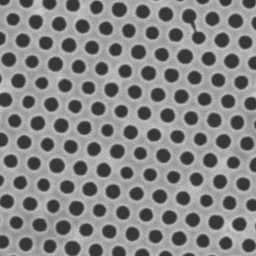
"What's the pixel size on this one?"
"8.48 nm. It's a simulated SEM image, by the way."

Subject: a regular array of holes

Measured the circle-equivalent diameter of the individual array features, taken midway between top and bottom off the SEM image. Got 122 nanometres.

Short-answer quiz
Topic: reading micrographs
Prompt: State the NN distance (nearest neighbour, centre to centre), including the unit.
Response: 195 nanometres